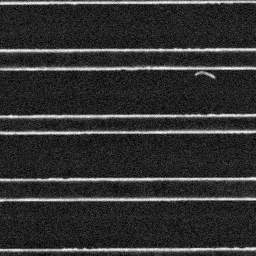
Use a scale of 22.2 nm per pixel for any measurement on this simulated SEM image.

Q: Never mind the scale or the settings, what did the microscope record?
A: lines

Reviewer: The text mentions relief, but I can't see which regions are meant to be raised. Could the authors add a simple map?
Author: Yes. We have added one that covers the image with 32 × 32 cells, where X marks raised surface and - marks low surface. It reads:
--------------------------------
--------------------------------
--------------------------------
--------------------------------
--------------------------------
--------------------------------
XXXXXXXXXXXXXXXXXXXXXXXXXXXXXXXX
XXXXXXXXXXXXXXXXXXXXXXXXXXXXXXXX
XXXXXXXXXXXXXXXXXXXXXXXXXXXXXXXX
--------------------------------
--------------------------------
--------------------------------
--------------------------------
--------------------------------
------X-XXXXXXXXXXXXXXXXXXXXXXXX
XXXXXXXXXXXXXXXXXXXXXXXXXXXXXXXX
XXXXXXXXXXXXXXXXXXXXXXXXXXXX----
--------------------------------
--------------------------------
--------------------------------
--------------------------------
--------------------------------
XXXXXXXXXXXXXXXXXXXXXXXXXXXXXXXX
XXXXXXXXXXXXXXXXXXXXXXXXXXXXXXXX
XXXXXXXXXXXXXXXXXXXXXXXXXXXXXXXX
--------------------------------
--------------------------------
--------------------------------
--------------------------------
--------------------------------
--------------------------------
XXXXXXXXXXXXXXXXXXXXXXXXXXXXXXXX